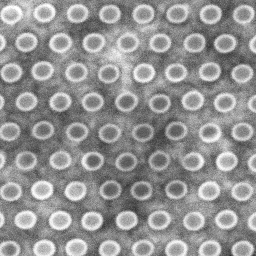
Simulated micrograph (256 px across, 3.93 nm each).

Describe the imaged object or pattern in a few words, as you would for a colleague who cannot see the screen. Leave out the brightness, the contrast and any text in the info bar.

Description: a regular array of raised bodies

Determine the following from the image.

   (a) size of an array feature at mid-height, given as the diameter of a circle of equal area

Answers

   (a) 73.1 nanometers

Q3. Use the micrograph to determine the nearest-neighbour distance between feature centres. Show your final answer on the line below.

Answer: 127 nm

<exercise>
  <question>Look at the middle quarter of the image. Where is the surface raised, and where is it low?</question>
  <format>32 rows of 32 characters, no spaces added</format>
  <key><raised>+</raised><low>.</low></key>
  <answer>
..+++.....++.......+++.....++...
.+++++...+++++....++++....++++..
.+++++...+++++....++++....++++..
.++++....++++.....++++....++++..
..........++....................
................................
................................
......++.......++..............+
+....++++....+++++....++++....++
+....+++++...+++++....++++....++
+....++++....+++++....++++....++
......++.......+......+++.......
................................
................................
................................
..+++.....+++......++.....++++..
.+++++...+++++...+++++....++++..
.+++++...+++++...+++++....++++..
.++++....++++.....++++.....++...
................................
................................
................................
+.....+++.............+++.......
+....+++++...+++++....++++....++
+....+++++...+++++...+++++....++
+....++++....+++++....++++....++
...............+................
................................
................................
...........................++...
.++++.....++++...++++.....++++..
.++++....+++++...+++++....++++..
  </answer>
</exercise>